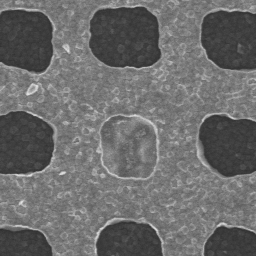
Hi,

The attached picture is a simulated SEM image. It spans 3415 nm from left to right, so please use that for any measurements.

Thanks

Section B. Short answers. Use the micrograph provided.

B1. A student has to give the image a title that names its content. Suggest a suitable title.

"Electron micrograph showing holes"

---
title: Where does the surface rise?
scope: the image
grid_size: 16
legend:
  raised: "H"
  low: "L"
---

HHHHHHHLLHHHHHHH
LLLHHHLLLLHHHLLL
LLLHHHLLLLHHHLLL
LLLHHHLLLLHHHLLL
HHLHHHHHHHHHHHHH
HHHHHHHHHHHHHHHH
HHHHHHHHHHHHHHHH
LLLHHHHHHHHHHLLL
LLLHHHHHHHHHLLLL
LLLHHHHHHHHHHLLL
LLLHHHHHHHHHHLLL
HHHHHHHHHHHHHHHH
HHHHHHHHHHHHHHHH
HHHHHHHHHHHHHHHH
LLHHHHLLLLHHHLLL
LLLHHHLLLLHHHLLL